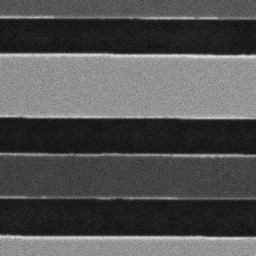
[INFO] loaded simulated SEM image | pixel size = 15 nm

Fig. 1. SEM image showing lines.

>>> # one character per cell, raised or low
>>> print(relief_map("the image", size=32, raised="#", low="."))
################################
################################
................................
................................
................................
................................
................................
################################
################################
################################
################################
################################
################################
################################
################################
................................
................................
................................
................................
################################
################################
################################
################################
################################
################################
................................
................................
................................
................................
................................
################################
################################